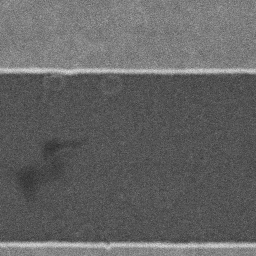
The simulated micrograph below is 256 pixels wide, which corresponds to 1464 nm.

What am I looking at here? one or a few lines or trenches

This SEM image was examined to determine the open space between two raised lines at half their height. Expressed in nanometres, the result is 1000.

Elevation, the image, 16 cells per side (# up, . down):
################
################
################
################
................
................
................
................
................
................
................
................
................
................
................
################